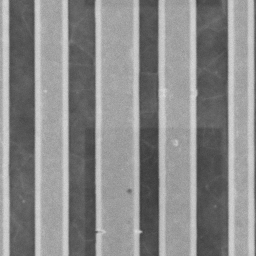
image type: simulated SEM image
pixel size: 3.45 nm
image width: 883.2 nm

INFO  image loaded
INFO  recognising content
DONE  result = one or a few lines or trenches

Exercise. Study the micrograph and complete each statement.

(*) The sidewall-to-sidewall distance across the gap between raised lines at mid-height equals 112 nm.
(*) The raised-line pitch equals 218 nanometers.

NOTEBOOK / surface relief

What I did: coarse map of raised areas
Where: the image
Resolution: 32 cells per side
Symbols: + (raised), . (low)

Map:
+....+++....+++++...++++.....++.
+....+++....+++++...++++.....++.
+....+++....+++++...++++.....++.
+....+++....+++++...++++.....++.
+....+++....+++++...++++.....++.
+....+++....+++++...++++.....++.
+....+++....+++++...++++.....++.
+....+++....+++++...++++.....++.
+....+++....+++++...++++.....++.
+....+++....+++++...++++.....++.
+....+++....+++++...++++.....++.
+....+++....+++++...++++.....++.
+....+++....+++++...++++.....++.
+....+++....+++++...++++.....++.
+....+++....+++++...++++.....++.
+....+++....+++++...++++.....++.
+....+++....+++++...++++.....++.
+....+++....+++++...++++.....++.
+....+++....+++++...++++.....++.
+....+++....+++++...++++.....++.
+....+++....+++++...++++.....++.
+....+++....+++++...++++.....++.
+....+++....+++++...++++.....++.
+....+++....+++++...++++.....++.
+....+++....+++++...++++.....++.
+....+++....+++++...++++.....++.
+....+++....+++++...++++.....++.
+....+++....+++++...++++.....++.
+....+++....+++++...++++.....++.
+....+++....+++++...++++.....++.
+....+++....+++++...++++.....++.
+....+++....+++++...++++.....++.